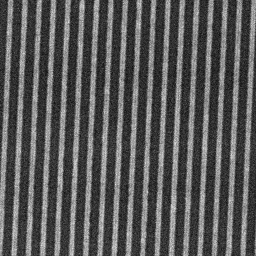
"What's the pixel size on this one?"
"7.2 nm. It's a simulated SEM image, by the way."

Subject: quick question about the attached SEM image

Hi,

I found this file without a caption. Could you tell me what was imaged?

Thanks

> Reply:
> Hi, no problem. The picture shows parallel lines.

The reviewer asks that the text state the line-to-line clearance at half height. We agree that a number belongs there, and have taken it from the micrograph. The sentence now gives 80.9 nm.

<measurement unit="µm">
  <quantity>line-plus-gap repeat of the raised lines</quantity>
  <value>0.103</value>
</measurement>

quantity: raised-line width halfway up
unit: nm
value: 25.2